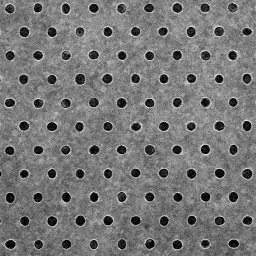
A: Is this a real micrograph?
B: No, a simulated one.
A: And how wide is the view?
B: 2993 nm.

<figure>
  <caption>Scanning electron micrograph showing a regular array of holes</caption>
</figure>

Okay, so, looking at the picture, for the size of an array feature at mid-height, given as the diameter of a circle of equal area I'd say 9.5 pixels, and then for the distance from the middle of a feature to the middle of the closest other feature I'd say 317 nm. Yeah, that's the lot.